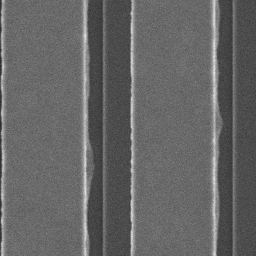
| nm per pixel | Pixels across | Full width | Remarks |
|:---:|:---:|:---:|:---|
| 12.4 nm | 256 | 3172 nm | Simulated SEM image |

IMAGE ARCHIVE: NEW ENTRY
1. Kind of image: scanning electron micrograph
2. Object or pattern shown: lines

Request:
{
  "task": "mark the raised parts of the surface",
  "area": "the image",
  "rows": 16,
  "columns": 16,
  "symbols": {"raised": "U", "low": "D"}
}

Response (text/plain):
UUUUUDDDUUUUUDDD
UUUUUDDDUUUUUDDD
UUUUUDDDUUUUUDDD
UUUUUDDDUUUUUDDD
UUUUUDDDUUUUUDDD
UUUUUDDDUUUUUDDD
UUUUUDDDUUUUUDDD
UUUUUDDDUUUUUDDD
UUUUUDDDUUUUUDDD
UUUUUDDDUUUUUDDD
UUUUUDDDUUUUUDDD
UUUUUDDDUUUUUDDD
UUUUUDDDUUUUUDDD
UUUUUDDDUUUUUDDD
UUUUUDDDUUUUUDDD
UUUUUDDDUUUUUDDD